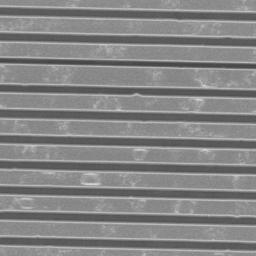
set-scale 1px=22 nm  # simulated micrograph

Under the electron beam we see parallel lines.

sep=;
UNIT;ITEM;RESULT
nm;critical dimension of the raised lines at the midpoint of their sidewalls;391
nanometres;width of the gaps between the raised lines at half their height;184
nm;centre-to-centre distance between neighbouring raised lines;562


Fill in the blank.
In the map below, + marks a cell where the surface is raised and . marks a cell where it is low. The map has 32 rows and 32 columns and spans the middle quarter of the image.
+++++++++++++...................
++++++++++++++++++++++++++++++++
++++++++++++++++++++++++++++++++
++++++++++++++++++++++++++++++++
++++++++++++++++++++++++++++++++
.+++++++++++++++++++++++++++++++
................................
+++++.............+.............
++++++++++++++++++++++++++++++++
++++++++++++++++++++++++++++++++
++++++++++++++++++++++++++++++++
++++++++++++++++++++++++++++++++
................................
................................
+++++++++++++++++++++++++...++..
++++++++++++++++++++++++++++++++
++++++++++++++++++++++++++++++++
++++++++++++++++++++++++++++++++
.........................+++++++
................................
++++++++++......................
++++++++++++++++++++++++++++++++
++++++++++++++++++++++++++++++++
++++++++++++++++++++++++++++++++
.+++++++..++++++++++++++++++++++
................................
................................
++++++++++++++++++++++++++++++++
++++++++++++++++++++++++++++++++
++++++++++++++++++++++++++++++++
++++++++++++++++++++++++++++++++
..............................++